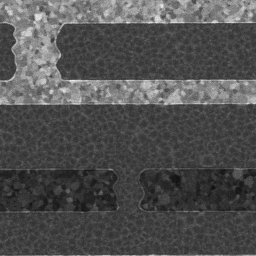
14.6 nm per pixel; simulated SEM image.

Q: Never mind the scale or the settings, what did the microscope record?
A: one or a few lines or trenches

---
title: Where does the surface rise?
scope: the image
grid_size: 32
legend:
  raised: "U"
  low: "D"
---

UUUUUUUUUUUUUUUUUUUUUUUUUUUUUUUU
UUUUUUUUUUUUUUUUUUUUUUUUUUUUUUUU
UUUUUUUUUUUUUUUUUUUUUUUUUUUUUUUU
DDUUUUUUDDDDDDDDDDDDDDDDDDDDDDDD
DDUUUUUDDDDDDDDDDDDDDDDDDDDDDDDD
DDUUUUUDDDDDDDDDDDDDDDDDDDDDDDDD
DDUUUUUDDDDDDDDDDDDDDDDDDDDDDDDD
DDUUUUUDDDDDDDDDDDDDDDDUDDDDDDDD
DDUUUUUDDDDDDDDDDDDDDDDDDDDDDDDD
DDUUUUUUDDDDDDDDDDDDDDDDDDDDDDDD
UUUUUUUUUUUUUUUUUUUUUUUUUUUUUUUU
UUUUUUUUUUUUUUUUUUUUUUUUUUUUUUUU
UUUUUUUUUUUUUUUUUUUUUUUUUUUUUUUU
DDDDDDDDDDDDDDDDDDDDDDDDDDDDDDDD
DDDDDDDDDDDDDDDDDDDDDDDDDDDDDDDD
DDDDDDDDDDDDDDDDDDDDDDDDDDDDDDDD
DDDDDDDDDDDDDDDDDDDDDDDDDDDDDDDD
DDDDDDDDDDDDDDDDDDDDDDDDDDDDDDDU
DDDDDDDUUDDDDDDDDDDDDDDDDDDDDDDD
DDDDDDDDDDDDDDDDDDDDDDDDDDDDDDDD
DDDDDDDDDDDDDDDDDDDDDDDDDUUDDDDD
UUUUUUUUUUUUUUDDDDUUUUUUUUUUUUUU
UUUUUUUUUUUUUUUDDUUUUUUUUUUUUUUU
UUUUUUUUUUUUUUDDDDUUUUUUUUUUUUUU
UUUUUUUUUUUUUUUDDDUUUUUUUUUUUUUU
UUUUUUUUUUUUUUUDDUUUUUUUUUUUUUUU
DDDDDDDDDDDUDDDDDDDUUDDDDDDDDDDD
DDDDDDDDDDDDDDDDDDDDDDDDDDDDDDDD
DDDDDDDDDDDDDDDDDDDDDDDDDDDDDDDD
DDDDDDDDDDDDDDDDDDDDDDDDDDDDDDDD
DDDDDDDDDDDDDDDDDDDDDDDDDDDDDDDD
DDDDDDDDDDDDDDDDDDDDDDDDDDDDDDDD